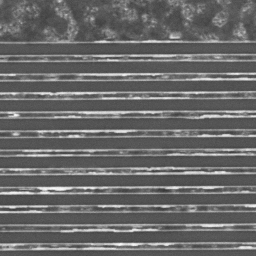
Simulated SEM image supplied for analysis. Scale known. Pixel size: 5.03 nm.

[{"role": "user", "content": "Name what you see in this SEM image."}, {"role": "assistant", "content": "parallel lines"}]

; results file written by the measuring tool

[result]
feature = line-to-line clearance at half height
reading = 60.3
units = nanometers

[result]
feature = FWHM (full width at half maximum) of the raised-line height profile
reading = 6.5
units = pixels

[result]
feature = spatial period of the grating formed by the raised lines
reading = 0.0947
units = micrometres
